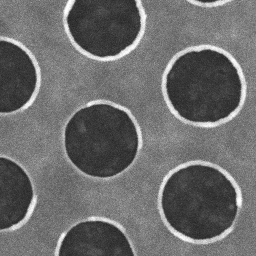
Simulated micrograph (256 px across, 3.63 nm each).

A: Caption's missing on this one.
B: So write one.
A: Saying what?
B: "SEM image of holes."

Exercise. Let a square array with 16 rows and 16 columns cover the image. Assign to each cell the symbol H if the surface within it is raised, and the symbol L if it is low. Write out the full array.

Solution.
HHHHLLLLLHHHHHHH
HHHHLLLLLHHHHHHH
HHHHHLLLHHHHHHHH
LLHHHHLHHHHLLLHH
LLHHHHHHHHHLLLLH
LLHHHHHHHHLLLLLH
LLHHHHHHHHHLLLLH
HHHHLLLLHHHHLLHH
HHHHLLLLLHHHHHHH
HHHHLLLLLHHHHHHH
LHHHHLLLHHHHLHHH
LLHHHHHHHHLLLLHH
LLHHHHHHHHLLLLLH
LLHHHHHHHHLLLLLH
HHHHLLLLHHHLLLHH
HHHHLLLLHHHHHHHH